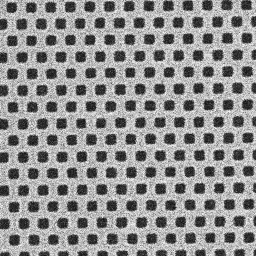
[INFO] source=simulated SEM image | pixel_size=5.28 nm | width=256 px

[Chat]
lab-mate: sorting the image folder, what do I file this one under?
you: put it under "a regular array of holes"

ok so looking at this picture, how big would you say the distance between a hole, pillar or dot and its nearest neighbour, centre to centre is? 100 nanometers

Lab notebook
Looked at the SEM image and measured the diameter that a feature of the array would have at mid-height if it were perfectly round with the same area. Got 0.0631 micrometres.